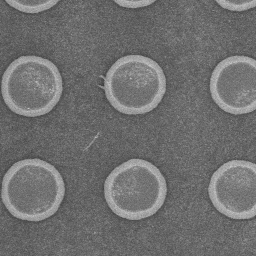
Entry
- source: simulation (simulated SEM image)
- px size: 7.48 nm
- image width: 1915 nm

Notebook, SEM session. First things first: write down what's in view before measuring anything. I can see raised bodies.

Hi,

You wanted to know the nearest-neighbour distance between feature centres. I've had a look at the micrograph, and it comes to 771 nanometres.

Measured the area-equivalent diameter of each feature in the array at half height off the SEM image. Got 0.411 micrometres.